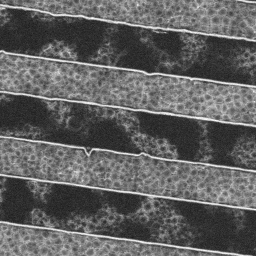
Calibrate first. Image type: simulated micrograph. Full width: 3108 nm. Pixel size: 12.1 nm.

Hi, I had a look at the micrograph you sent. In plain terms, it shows one or a few lines or trenches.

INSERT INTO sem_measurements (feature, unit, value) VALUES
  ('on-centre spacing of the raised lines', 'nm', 1020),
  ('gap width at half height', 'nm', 454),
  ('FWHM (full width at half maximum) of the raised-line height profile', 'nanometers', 567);